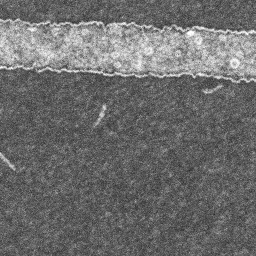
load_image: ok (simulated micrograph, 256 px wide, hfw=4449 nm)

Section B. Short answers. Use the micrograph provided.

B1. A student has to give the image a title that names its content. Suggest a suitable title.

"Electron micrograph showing one or a few lines or trenches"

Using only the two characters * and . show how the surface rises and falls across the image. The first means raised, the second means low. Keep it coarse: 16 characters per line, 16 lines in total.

****************
...**.**********
................
................
******..........
****************
****************
****************
****************
****************
****************
****************
****************
****************
****************
****************